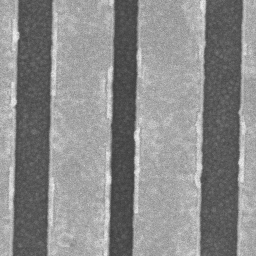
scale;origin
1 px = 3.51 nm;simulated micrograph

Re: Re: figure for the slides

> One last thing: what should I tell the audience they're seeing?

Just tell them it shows one or a few lines or trenches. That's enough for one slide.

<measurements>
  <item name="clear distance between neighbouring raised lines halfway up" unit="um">0.13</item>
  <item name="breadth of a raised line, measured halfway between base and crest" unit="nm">221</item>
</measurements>